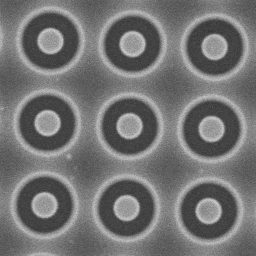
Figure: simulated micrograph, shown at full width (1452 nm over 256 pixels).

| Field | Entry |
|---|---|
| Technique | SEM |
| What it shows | an array of small figures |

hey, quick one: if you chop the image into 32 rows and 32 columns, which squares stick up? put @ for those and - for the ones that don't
@@@@@@@@@@@@@@@@@@@@@@@@@@@@@@@@
@@@@@---@@@@@@@@@@@@@@@@@@@@@@@@
@@@@-----@@@@@-----@@@@@@----@@@
@@@-------@@@-------@@@@------@@
@@@--@@@--@@@---@@--@@@---@---@@
@@@--@@@--@@@--@@@--@@@--@@@---@
@@@---@---@@@--@@@--@@@--@@@---@
@@@------@@@@-------@@@-------@@
@@@@@---@@@@@@-----@@@@@------@@
@@@@@@@@@@@@@@@@@@@@@@@@@@--@@@@
@@@@@@@@@@@@@@@@@@@@@@@@@@@@@@@@
@@@@@@@@@@@@@@@@@@@@@@@@@@@@@@@@
@@@-----@@@@@@----@@@@@@@---@@@@
@@@------@@@@------@@@@@-----@@@
@@---@@---@@@--@@---@@@-------@@
@@---@@---@@---@@@--@@@--@@@--@@
@@---@@---@@@--@@---@@@--@@@--@@
@@@------@@@@-------@@@---@---@@
@@@@----@@@@@@-----@@@@-------@@
@@@@@@@@@@@@@@@--@@@@@@@@---@@@@
@@@@@@@@@@@@@@@@@@@@@@@@@@@@@@@@
@@@@@@@@@@@@@@@@@@@@@@@@@@@@@@@@
@@@-----@@@@@@---@@@@@@@@@@@@@@@
@@@------@@@@------@@@@@-----@@@
@@---@---@@@-------@@@@------@@@
@@--@@@--@@@--@@@---@@---@@---@@
@@--@@@--@@@--@@@---@@---@@@--@@
@@-------@@@-------@@@---@@---@@
@@@-----@@@@@------@@@@------@@@
@@@@@-@@@@@@@@---@@@@@@@----@@@@
@@@@@@@@@@@@@@@@@@@@@@@@@@@@@@@@
@@@@@@@@@@@@@@@@@@@@@@@@@@@@@@@@